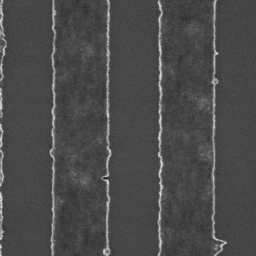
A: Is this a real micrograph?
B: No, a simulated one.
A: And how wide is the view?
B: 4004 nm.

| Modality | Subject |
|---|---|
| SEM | one or a few lines or trenches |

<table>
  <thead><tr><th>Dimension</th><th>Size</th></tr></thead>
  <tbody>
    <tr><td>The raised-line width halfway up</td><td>0.864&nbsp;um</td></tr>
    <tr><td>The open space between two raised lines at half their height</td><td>794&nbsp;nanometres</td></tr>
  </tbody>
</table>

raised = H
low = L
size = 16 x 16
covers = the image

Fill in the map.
LLLHHHHLLLHHHLLL
LLLHHHHLLLHHHLLL
LLLHHHHLLLHHHLLL
LLLHHHHLLLHHHLLL
LLLHHHHLLLHHHLLL
LLLHHHHLLLHHHLLL
LLLHHHHLLLHHHLLL
LLLHHHHLLLHHHLLL
LLLHHHHLLLHHHLLL
LLLHHHHLLLHHHLLL
LLLHHHHLLLHHHLLL
LLLHHHHLLLHHHLLL
LLLHHHHLLLHHHLLL
LLLHHHHLLLHHHLLL
LLLHHHHLLLHHHLLL
LLLHHHHLLLHHHHLL